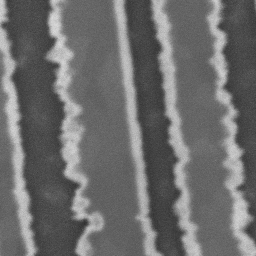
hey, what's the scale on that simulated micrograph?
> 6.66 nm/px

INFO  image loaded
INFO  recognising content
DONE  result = one or a few lines or trenches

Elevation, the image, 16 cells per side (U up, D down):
DDDUUUUDDDUUUUDD
DDDUUUUUDDUUUDDD
DDDDUUUUDDUUUUDD
DDDDUUUUDDUUUUDD
UDDDUUUUDDDUUUDD
UDDDUUUUDDDUUUDD
UDDDUUUUDDDUUUDD
UDDDUUUUDDDUUUDD
UDDDUUUUUDDUUUUD
UDDDUUUUUDDUUUUD
UDDDUUUUUDDUUUUD
UDDDDUUUUDDUUUUD
UDDDDUUUUDDUUUUD
UUDDDUUUUDDDUUUD
UUDDDUUUUDDDUUUD
UUDDDUUUUDDDUUUU